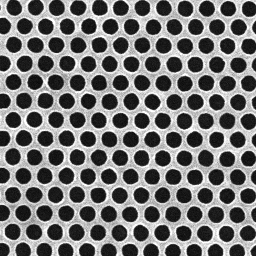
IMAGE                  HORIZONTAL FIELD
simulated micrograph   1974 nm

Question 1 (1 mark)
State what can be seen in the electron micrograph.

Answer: a regular array of holes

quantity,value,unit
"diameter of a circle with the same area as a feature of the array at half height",124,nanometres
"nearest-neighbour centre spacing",0.163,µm